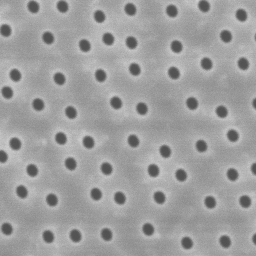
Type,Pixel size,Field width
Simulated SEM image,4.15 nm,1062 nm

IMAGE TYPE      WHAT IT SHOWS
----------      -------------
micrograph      a regular array of holes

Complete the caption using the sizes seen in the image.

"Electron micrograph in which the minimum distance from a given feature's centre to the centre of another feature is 114 nanometers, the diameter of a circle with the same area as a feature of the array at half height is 52.2 nm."